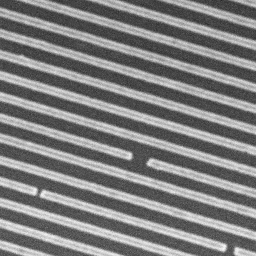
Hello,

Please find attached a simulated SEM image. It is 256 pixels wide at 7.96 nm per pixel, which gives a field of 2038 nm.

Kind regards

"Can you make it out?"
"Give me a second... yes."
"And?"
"parallel lines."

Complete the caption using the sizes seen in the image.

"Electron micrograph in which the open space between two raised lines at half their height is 116 nanometres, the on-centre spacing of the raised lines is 161 nm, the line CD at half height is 0.0391 µm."